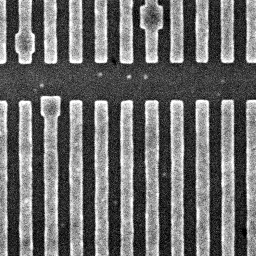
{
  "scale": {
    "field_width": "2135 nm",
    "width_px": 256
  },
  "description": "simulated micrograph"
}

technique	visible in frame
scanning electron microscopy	wiring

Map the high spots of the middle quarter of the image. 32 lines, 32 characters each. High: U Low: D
DDDDDDDDDDDDDDDDDDDDDDDDDDDDDDDD
DDDDDDDDDDDDDDDDDDDDDDDDDDDDDDDD
DDDDDDDDDDDDDDDDDDDDDDDDDDDDDDDD
DDDDDDDDDDDDDDDDDDDDDDDDDDDDDDDD
DDDDDDDDDDDDDDDDDDDDDDDDDDDDDDDD
DDDDDDDDDDDDDDDDDDDDDDDDDDDDDDDD
DDDDDDDDDDDDDDDDDDDDDDDDDDDDDDDD
DDDDDDDDDDDDDDDDDDDDDDDDDDDDDDDD
DDDDDDDDDDDDDDDDDDDDDDDDDDDDDDDD
DDUUDDDDUUDDDDDUUDDDDUUDDDDUUDDD
DDUUDDDDUUUDDDUUUDDDUUUDDDDUUUDD
DDUUDDDDUUUDDDUUUDDDUUUDDDDUUUDD
DDUUDDDDUUUDDDUUUDDDUUUDDDDUUUDD
DDUUDDDDUUUDDDUUUDDDDUUDDDDUUUDD
DDUUDDDDUUUDDDUUUDDDDUUDDDDUUUDD
DDUUDDDDUUUDDDUUUDDDUUUDDDDUUUDD
DDUUDDDDUUUDDDUUUDDDUUUDDDDUUUDD
DDUUDDDDUUUDDDUUUDDDUUUDDDDUUUDD
DDUUDDDDUUUDDDUUUDDDUUUDDDDUUUDD
DDUUDDDDUUUDDDUUUDDDUUUDDDDUUUDD
DDUUDDDDUUUDDDUUUDDDUUUDDDDUUUDD
DDUUDDDDUUUDDDUUUDDDUUUDDDDUUUDD
DDUUDDDDUUUDDDUUUDDDUUUDDDDUUUDD
DDUUDDDDUUUDDDUUUDDDUUUDDDDUUUDD
DDUUDDDDUUUDDDUUUDDDUUUDDDDUUUDD
DUUUDDDDUUUDDDUUUDDDDUUDDDDUUUDD
DDUUDDDDUUUDDDUUUDDDDUUDDDDUUUDD
DDUUDDDDUUUDDDUUUDDDDUUDDDDUUUDD
DDUUDDDDUUUDDDUUUDDDDUUDDDDUUUDD
DDUUDDDDUUUDDDUUUDDDDUUDDDDUUUDD
DDUUDDDDUUUDDDUUUDDDDUUDDDDUUUDD
DDUUDDDDUUUDDDUUUDDDDUUDDDDUUUDD